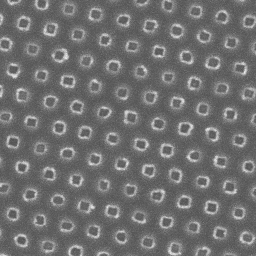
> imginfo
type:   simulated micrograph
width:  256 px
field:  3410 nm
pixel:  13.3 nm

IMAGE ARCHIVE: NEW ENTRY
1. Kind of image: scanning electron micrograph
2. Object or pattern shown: a regular array of holes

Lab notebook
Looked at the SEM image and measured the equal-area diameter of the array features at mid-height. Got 128 nanometres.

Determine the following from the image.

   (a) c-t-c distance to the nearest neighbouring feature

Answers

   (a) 358 nm